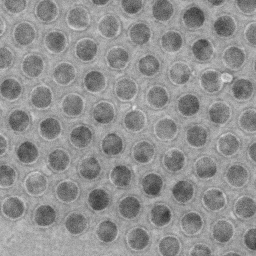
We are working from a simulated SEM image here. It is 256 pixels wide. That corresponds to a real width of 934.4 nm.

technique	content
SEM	a regular array of raised bodies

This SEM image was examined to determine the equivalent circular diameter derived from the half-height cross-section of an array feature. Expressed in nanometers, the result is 86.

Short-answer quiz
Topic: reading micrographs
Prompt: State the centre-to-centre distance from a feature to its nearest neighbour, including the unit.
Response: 117 nm